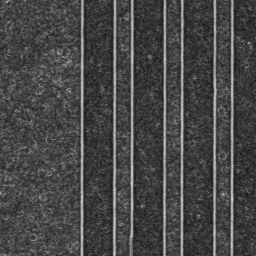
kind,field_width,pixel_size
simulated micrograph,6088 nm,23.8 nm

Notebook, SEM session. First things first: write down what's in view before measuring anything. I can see parallel lines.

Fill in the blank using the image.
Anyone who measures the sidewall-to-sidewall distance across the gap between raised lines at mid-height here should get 779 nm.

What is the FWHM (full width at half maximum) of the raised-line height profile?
410 nm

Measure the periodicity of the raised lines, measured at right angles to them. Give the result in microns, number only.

1.19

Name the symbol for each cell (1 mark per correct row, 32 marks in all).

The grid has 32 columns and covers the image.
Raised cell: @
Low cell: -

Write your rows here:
@@@@@@@@@@----@@-----@@----@@---
@@@@@@@@@@----@@-----@@----@@---
@@@@@@@@@@----@@-----@@----@@---
@@@@@@@@@@----@@-----@@----@@---
@@@@@@@@@@----@@-----@@----@@---
@@@@@@@@@@----@@-----@@----@@---
@@@@@@@@@@----@@-----@@----@@---
@@@@@@@@@@----@@-----@@----@@---
@@@@@@@@@@----@@-----@@----@@---
@@@@@@@@@@----@@-----@@----@@---
@@@@@@@@@@----@@-----@@----@@---
@@@@@@@@@@----@@-----@@----@@---
@@@@@@@@@@----@@-----@@----@@---
@@@@@@@@@@----@@-----@@----@@---
@@@@@@@@@@----@@-----@@----@@---
@@@@@@@@@@----@@-----@@----@@---
@@@@@@@@@@----@@-----@@----@@---
@@@@@@@@@@----@@-----@@----@@---
@@@@@@@@@@----@@-----@@----@@---
@@@@@@@@@@----@@-----@@----@@---
@@@@@@@@@@----@@-----@@----@@---
@@@@@@@@@@----@@-----@@----@@---
@@@@@@@@@@----@@-----@@----@@---
@@@@@@@@@@----@@-----@@----@@---
@@@@@@@@@@----@@-----@@----@@---
@@@@@@@@@@----@@-----@@----@@---
@@@@@@@@@@----@@-----@@----@@---
@@@@@@@@@@----@@-----@@----@@---
@@@@@@@@@@----@@-----@@----@@---
@@@@@@@@@@----@@-----@@----@@---
@@@@@@@@@@----@@-----@@----@@---
@@@@@@@@@@----@@-----@@----@@---